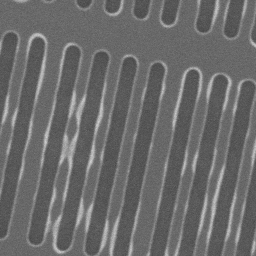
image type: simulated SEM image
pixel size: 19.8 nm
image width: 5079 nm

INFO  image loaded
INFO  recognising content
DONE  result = groups of lines, slits or small figures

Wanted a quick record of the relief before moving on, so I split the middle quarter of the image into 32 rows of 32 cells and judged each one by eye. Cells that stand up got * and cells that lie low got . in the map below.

....***....***....****...*******
....***....***....***.....*****.
...***.....***....***....*****..
...***....****....***....*****..
...***....****....***....*****..
...***....***....****....*****..
...**.....***....***.....****...
...**.....***....***....*****...
...**.....***....***....*****...
..***.....**.....***....*****...
..**......**.....**.....****....
..**......**....***.....****....
..**.....***....***....*****....
.**......***....***....*****....
.***.....**.....***....*****....
.***....***....****....****.....
.**.....***....***.....****.....
***.....***....***....*****....*
.**.....***....***....*****....*
.**....***....****....*****....*
.*.....***....***.....*****....*
**.....***....***....*****.....*
**.....**.....***....*****.....*
*......**.....***....*****....**
**.....**.....***....*****....**
**....***....***.....****.....**
*.....***....***.....****.....**
*.....***....***....*****.....**
*....****....***....*****....***
*....***....****....*****....***
*....***....***.....*****....***
.....***....***....*****.....***